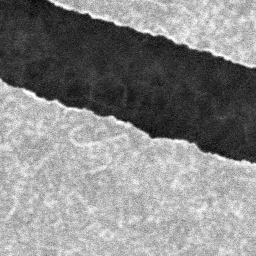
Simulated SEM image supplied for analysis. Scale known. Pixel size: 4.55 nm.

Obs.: one or a few lines or trenches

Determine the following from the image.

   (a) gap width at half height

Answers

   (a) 427 nm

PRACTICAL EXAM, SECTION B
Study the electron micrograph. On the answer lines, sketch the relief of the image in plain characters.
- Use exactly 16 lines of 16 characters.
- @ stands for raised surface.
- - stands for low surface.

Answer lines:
----@@@@@@@@@@@@
-------@@@@@@@@@
-----------@@@@@
--------------@@
----------------
@---------------
@@@@------------
@@@@@@@---------
@@@@@@@@@-------
@@@@@@@@@@@@@---
@@@@@@@@@@@@@@@@
@@@@@@@@@@@@@@@@
@@@@@@@@@@@@@@@@
@@@@@@@@@@@@@@@@
@@@@@@@@@@@@@@@@
@@@@@@@@@@@@@@@@